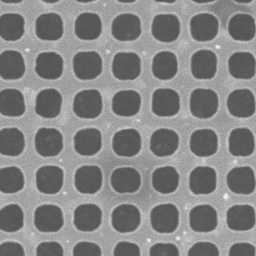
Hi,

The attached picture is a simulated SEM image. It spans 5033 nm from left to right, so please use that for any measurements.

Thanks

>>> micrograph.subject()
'a regular array of holes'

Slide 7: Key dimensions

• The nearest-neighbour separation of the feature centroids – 0.738 um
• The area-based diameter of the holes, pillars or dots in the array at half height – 580 nm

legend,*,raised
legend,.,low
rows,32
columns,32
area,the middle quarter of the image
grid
**........**.......***......****
**........**.......***......****
***......***.......***......****
****....*****.....*****....*****
********************************
********************************
*****...******...******....*****
***......****......***.......***
***......***.......***.......***
**........**.......***.......**.
**........**.......***.......**.
**.......***.......***.......***
***......****.....*****.....****
****....************************
********************************
********************************
****....******....*****....*****
***......****......***......****
***......***.......***.......**.
**........**.......**........**.
**.......***.......**........**.
***......***.......***......****
****....*****.....****.....*****
********************************
********************************
*****...******************.*****
***......****.....*****.....****
***.......**.......***.......**.
***.......**.......***.......**.
***.......**.......***.......**.
***......***.......***.......**.
***......****.....*****.....****